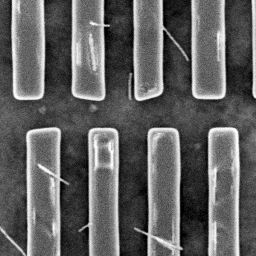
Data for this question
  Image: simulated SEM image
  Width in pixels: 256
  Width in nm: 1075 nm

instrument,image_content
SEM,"wiring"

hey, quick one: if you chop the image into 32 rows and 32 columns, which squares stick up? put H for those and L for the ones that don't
LLHHHLLLLHHHHLLLLHHHLLLLHHHHLLLL
LLHHHLLLLHHHHLLLLHHHLLLLHHHHLLLL
LLHHHLLLLHHHHLLLLHHHLLLLHHHHLLLL
LLHHHLLLLHHHHLLLLHHHLLLLHHHHLLLL
LLHHHLLLLHHHHLLLLHHHLLLLHHHHLLLL
LLHHHLLLLHHHHLLLLHHHLLLLHHHHLLLL
LLHHHLLLLHHHHLLLLHHHLLLLHHHHLLLL
LLHHHLLLLHHHHLLLLHHHLLLLHHHHLLLL
LLHHHLLLLHHHHLLLLHHHLLLLHHHHLLLL
LLHHHLLLLHHHHLLLLHHHLLLLHHHHLLLL
LLHHHLLLLHHHHLLLLHHHLLLLHHHHLLLL
LLHHHLLLLHHHHLLLLHHHLLLLHHHHLLLL
LLLLLLLLLLLHHLLLLHLLLLLLLLLLLLLL
LLLLLLLLLLLLLLLLLLLLLLLLLLLLLLLL
LLLLLLLLLLLLLLLLLLLLLLLLLLLLLLLL
LLLLLLLLLLLLLLLLLLLLLLLLLLLLLLLL
LLLLHHHHLLLHHHHLLLLHHHLLLLHHHHLL
LLLHHHHHLLLHHHHLLLLHHHLLLLHHHHLL
LLLHHHHLLLLHHHHLLLLHHHLLLLHHHHLL
LLLHHHHLLLLHHHHLLLLHHHLLLLHHHHLL
LLLHHHHLLLLHHHHLLLLHHHLLLLHHHHLL
LLLHHHHLLLLHHHHLLLLHHHLLLLHHHHLL
LLLHHHHHLLLHHHHLLLLHHHLLLLHHHHLL
LLLHHHHLLLLHHHHLLLLHHHLLLLHHHHLL
LLLHHHHLLLLHHHHLLLLHHHLLLLHHHHLL
LLLHHHHLLLLHHHHLLLLHHHLLLLHHHHLL
LLLHHHHLLLLHHHHLLLLHHHLLLLHHHHLL
LLLHHHHLLLLHHHHLLLLHHHLLLLHHHHLL
LLLHHHHLLLLHHHHLLLLHHHLLLLHHHHLL
LLLHHHHLLLLHHHHLLLHHHHLLLLHHHHLL
LLLHHHHLLLLHHHHLLLLHHHHLLLHHHHLL
LLLHHHHLLLLHHHHLLLLHHHHLLLHHHHLL